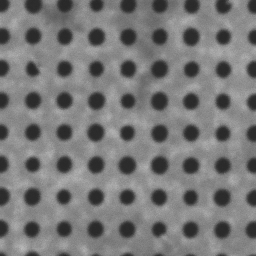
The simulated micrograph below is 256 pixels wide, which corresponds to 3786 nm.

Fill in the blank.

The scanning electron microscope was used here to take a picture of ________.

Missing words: a regular array of holes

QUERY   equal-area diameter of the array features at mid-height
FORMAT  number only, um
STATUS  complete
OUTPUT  0.244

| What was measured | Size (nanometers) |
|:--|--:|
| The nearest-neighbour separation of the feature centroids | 465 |